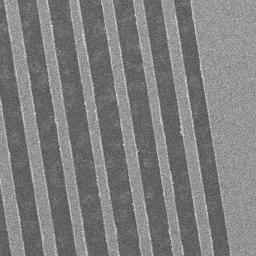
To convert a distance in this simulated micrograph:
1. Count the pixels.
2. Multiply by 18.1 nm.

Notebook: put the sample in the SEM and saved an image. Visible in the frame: parallel lines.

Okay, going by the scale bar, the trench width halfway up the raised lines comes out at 350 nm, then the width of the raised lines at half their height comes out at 207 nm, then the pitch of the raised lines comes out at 560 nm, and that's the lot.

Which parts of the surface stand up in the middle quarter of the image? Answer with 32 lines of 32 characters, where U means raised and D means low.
DDDDUUDDDDDDUUUDDDDDUUDDDDDUUUDD
DDDDUUUDDDDDUUUDDDDDUUDDDDDUUUDD
DDDDUUUDDDDDUUUDDDDDUUUDDDDUUUDD
DDDDUUUDDDDDUUUDDDDDUUUDDDDUUUUD
DDDDUUUDDDDDDUUDDDDDDUUDDDDUUUUD
DDDDDUUDDDDDDUUDDDDDDUUDDDDDUUUD
DDDDDUUDDDDDDUUUDDDDDUUDDDDDUUUD
DDDDDUUUDDDDDUUUDDDDDUUDDDDDUUUD
DDDDDUUUDDDDDUUUDDDDDUUUDDDDUUUD
DDDDDUUUDDDDDUUUDDDDDUUUDDDDUUUD
DDDDDUUUDDDDDUUUDDDDDDUUDDDDUUUD
DDDDDDUUDDDDDDUUUDDDDDUUDDDDDUUU
DDDDDDUUDDDDDDUUUDDDDDUUDDDDDUUU
DDDDDDUUDDDDDDUUUDDDDDUUDDDDDUUU
UDDDDDUUUDDDDDUUUDDDDDUUDDDDDUUU
UDDDDDUUUDDDDDUUUDDDDDUUUDDDDUUU
UDDDDDUUUDDDDDUUUDDDDDUUUDDDDUUU
UDDDDDDUUDDDDDDUUDDDDDDUUDDDDUUU
UDDDDDDUUDDDDDDUUUDDDDDUUDDDDDUU
UDDDDDDUUDDDDDDUUUDDDDDUUDDDDDUU
UUDDDDDUUUDDDDDUUUDDDDDUUUDDDDUU
UUDDDDDUUUDDDDDUUUDDDDDUUUDDDDUU
UUDDDDDUUUDDDDDUUUDDDDDUUUDDDDUU
UUDDDDDUUUDDDDDDUUUDDDDDUUDDDDDU
UUDDDDDDUUDDDDDDUUUDDDDDUUDDDDDU
UUDDDDDDUUDDDDDDUUUDDDDDUUDDDDDU
UUDDDDDDUUUDDDDDUUUDDDDDUUUDDDDU
UUUDDDDDUUUDDDDDUUUDDDDDUUUDDDDU
UUUDDDDDUUUDDDDDUUUDDDDDUUUDDDDU
UUUDDDDDUUUDDDDDUUUDDDDDDUUDDDDD
DUUDDDDDUUUDDDDDDUUUDDDDDUUDDDDD
DUUDDDDDDUUDDDDDDUUUDDDDDUUDDDDD